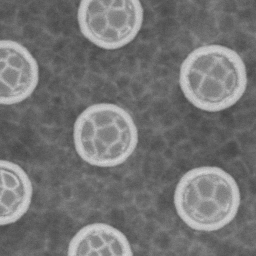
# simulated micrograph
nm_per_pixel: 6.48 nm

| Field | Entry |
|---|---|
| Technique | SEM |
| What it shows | raised bodies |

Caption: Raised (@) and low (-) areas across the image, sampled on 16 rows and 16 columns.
-----@@@@-------
-----@@@@-------
------@@--------
@@----------@@@-
@@---------@@@@-
@@----------@@@-
------------@@--
-----@@@--------
-----@@@--------
-----@@@--------
@---------------
@@---------@@@@-
@@---------@@@@-
@-----------@@--
-----@@---------
-----@@@--------